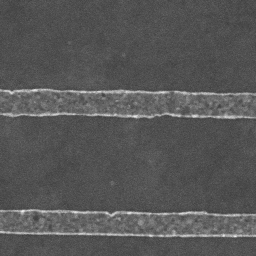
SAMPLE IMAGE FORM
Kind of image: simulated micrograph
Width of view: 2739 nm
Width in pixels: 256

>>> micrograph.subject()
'one or a few lines or trenches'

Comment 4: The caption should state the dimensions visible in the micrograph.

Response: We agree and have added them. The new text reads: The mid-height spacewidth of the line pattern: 1040 nanometres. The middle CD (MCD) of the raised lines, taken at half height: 0.244 um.